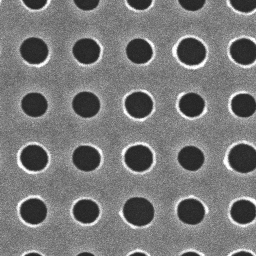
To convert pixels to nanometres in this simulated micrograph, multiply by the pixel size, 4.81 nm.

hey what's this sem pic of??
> a regular array of holes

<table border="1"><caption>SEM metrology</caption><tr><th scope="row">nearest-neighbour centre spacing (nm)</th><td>251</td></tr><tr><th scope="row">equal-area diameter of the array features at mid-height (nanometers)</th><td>126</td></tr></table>